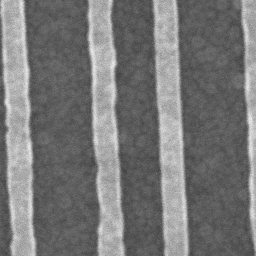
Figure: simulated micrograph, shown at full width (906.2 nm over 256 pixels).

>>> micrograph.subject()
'one or a few lines or trenches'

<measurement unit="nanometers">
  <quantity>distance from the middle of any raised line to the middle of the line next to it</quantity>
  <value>270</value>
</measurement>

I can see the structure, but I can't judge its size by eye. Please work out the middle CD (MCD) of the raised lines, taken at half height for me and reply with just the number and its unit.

70.8 nm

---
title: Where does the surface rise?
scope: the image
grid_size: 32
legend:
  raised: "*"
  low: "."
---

***........***.....***........**
***........***.....***........**
***........***......**........**
***........***......**.........*
***........***......**.........*
.**........***......**.........*
.**........***......**.........*
.**.........**......**.........*
.**.........**......**.........*
.**.........**......**.........*
.**.........**......**.........*
.**.........**......**.........*
.**.........**......**.........*
.***........**......**.........*
.**.........**......**.........*
.**.........**......***........*
.**.........**......***........*
.***........**......***........*
.***........***.....***........*
.***........***.....***........*
.***........***.....***........*
.***........***.....***........*
.***........***.....***........*
.***........***.....***........*
.***.........**.....***.........
.***.........**.....***........*
..**.........**......**.........
..**.........**......**.........
..**.........**......**.........
..**.........**......**.........
..**........***......**.........
..**........***......**.........